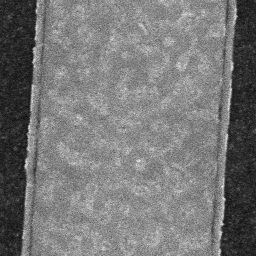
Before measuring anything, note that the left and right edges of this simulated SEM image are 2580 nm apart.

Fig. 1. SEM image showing one or a few lines or trenches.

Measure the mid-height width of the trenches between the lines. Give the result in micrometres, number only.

1.92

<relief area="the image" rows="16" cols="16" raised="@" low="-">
@@@-----------@@
@@------------@@
@@------------@@
@@------------@@
@@------------@@
@@------------@@
@@------------@@
@@------------@@
@@------------@@
@@------------@@
@@------------@@
@@------------@@
@@------------@@
@@------------@@
@@------------@@
@@-----------@@@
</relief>